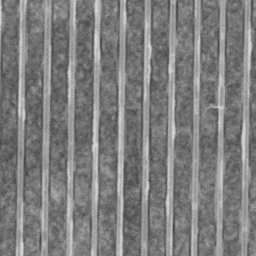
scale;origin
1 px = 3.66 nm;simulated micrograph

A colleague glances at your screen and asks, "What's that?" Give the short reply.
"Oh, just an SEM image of parallel lines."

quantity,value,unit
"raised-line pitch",91.5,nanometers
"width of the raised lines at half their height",22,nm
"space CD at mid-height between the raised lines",71.4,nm